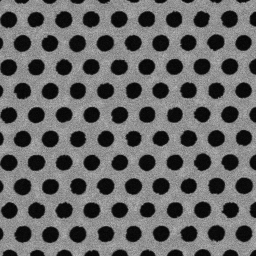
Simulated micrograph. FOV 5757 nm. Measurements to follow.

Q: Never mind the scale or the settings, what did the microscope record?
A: a regular array of holes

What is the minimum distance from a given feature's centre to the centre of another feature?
611 nm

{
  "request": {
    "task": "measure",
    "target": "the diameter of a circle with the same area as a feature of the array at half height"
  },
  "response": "373 nm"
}